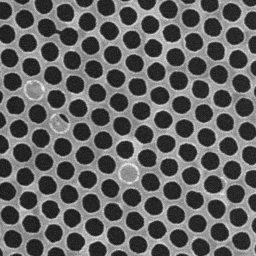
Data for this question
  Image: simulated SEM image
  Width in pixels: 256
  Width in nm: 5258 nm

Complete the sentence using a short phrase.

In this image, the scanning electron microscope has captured a regular array of holes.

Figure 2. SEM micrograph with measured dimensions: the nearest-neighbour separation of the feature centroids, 483 nm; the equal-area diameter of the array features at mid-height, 393 nanometres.